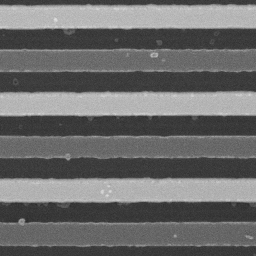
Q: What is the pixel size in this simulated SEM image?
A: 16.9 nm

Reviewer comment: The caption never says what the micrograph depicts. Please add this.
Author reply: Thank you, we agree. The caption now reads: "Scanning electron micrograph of lines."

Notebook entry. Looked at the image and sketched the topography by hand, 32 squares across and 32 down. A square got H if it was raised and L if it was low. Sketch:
LLLLLLLLLLLLLLLLLLLLLLLLLLLLLLLL
HHHHHHHHHHHHHHHHHHHHHHHHHHHHHHHH
HHHHHHHHHHHHHHHHHHHHHHHHHHHHHHHH
HHHHHHHHHHHHHHHHHHHHHHHHHHHHHHHH
LLLLLLLLLLLLLLLLLLLLLLLLLLLLLLLL
LLLLLLLLLLLLLLLLLLLLLLLLLLLLLLLL
HHHHHHHHHHHHHHHHHHHHHHHHHHHHHHHH
HHHHHHHHHHHHHHHHHHHHHHHHHHHHHHHH
HHHHHHHHHHHHHHHHHHHHHHHHHHHHHHHH
LLLLLLLLLLLLLLLLLLLLLLLLLLLLLLLL
LLLLLLLLLLLLLLLLLLLLLLLLLLLLLLLL
LLLLLLLLLLLLLLLLLLHLLLLLLLLLLHHH
HHHHHHHHHHHHHHHHHHHHHHHHHHHHHHHH
HHHHHHHHHHHHHHHHHHHHHHHHHHHHHHHH
LLLLLLLLLLLLLLLLLLLLLLLLLLLLLLLL
LLLLLLLLLLLLLLLLLLLLLLLLLLLLLLLL
LLLLLLLLLLLLLLLLLLLLLLLLLLLLLLLL
HHHHHHHHHHHHHHHHHHHHHHHHHHHHHHHH
HHHHHHHHHHHHHHHHHHHHHHHHHHHHHHHH
HHHHHHHHHHHHHHHHHHHHHHHHHHHHHHHH
LLLLLLLLLLLLLLLLLLLLLLLLLLLLLLLL
LLLLLLLLLLLLLLLLLLLLLLLLLLLLLLLL
HHHHHHHHHHHHHHHHHHHHHHHHHHHHHHHH
HHHHHHHHHHHHHHHHHHHHHHHHHHHHHHHH
HHHHHHHHHHHHHHHHHHHHHHHHHHHHHHHH
LLLLLLLLLLLLLLLLLLLLLLLLLLLLLLLL
LLLLLLLLLLLLLLLLLLLLLLLLLLLLLLLL
LLLLLLLLLLLLLLLLLLLLLLLLLLLLLLLL
HHHHHHHHHHHHHHHHHHHHHHHHHHHHHHHH
HHHHHHHHHHHHHHHHHHHHHHHHHHHHHHHH
HHHHHHHHHHHHHHHHHHHHHHHHHHHHHHHH
LLLLLLLLLLLLLLLLLLLLLLLLLLLLLLLL